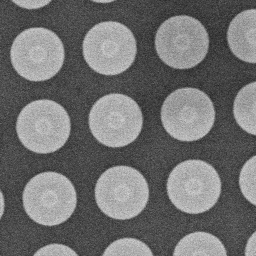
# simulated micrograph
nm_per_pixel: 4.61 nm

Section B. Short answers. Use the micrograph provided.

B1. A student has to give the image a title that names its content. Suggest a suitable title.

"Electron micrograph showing an array of small figures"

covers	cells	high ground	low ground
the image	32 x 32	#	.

..####..........................
..............................##
.....................####....###
....#.......####....######...###
..#####....######..#######..####
..######..#######..#######...###
.#######..#######...######...###
.#######...######...#####.....##
..######...#####......##........
...####.........................
...............................#
......................###.....##
.....#......#####....#####...###
...#####...######...#######..###
..#######..#######..#######..###
..#######..#######..#######...##
..#######..######....#####.....#
...#####....#####.....###.......
...####.........................
................................
......................####.....#
.............####....######...##
....#####...######...######...##
...######...#######..#######..##
...######...#######..######....#
...######...######....#####.....
...######....#####.....##.......
....####........................
................................
.......................####....#
..............####....######...#
.....####....######...######...#